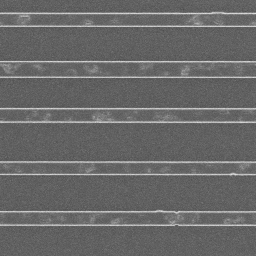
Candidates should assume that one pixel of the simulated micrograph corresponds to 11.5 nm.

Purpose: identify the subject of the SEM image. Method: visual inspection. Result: parallel lines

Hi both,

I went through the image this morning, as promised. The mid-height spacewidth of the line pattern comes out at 412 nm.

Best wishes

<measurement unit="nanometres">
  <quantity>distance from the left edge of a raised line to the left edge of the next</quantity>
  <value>569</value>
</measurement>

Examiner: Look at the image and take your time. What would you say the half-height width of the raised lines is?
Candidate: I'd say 162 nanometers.